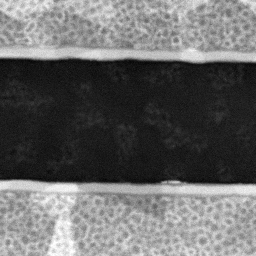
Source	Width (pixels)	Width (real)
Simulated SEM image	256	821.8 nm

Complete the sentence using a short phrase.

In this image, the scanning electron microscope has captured one or a few lines or trenches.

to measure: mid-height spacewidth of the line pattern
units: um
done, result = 0.432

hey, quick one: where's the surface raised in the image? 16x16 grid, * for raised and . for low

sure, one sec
****************
****************
****************
...............*
................
................
................
................
................
................
................
................
****************
****************
****************
****************